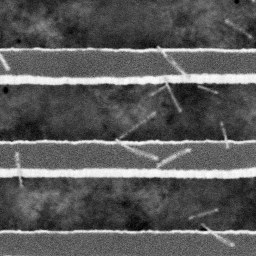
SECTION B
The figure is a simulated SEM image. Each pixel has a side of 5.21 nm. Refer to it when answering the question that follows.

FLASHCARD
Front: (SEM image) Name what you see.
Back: lines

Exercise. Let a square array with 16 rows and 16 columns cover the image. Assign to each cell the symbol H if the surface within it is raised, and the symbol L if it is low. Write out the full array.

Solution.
LLLLLLLLLLLLLLLL
LLLLLLLLLLLLLLLL
LLLLLLLLLLLLLLLL
HHHHHHHHHHHHHHHH
HHHHHHHHHHHHHHHH
LLLLLLLLLLLLLLLL
LLLLLLLLLLLLLLLL
LLLLLLLLLLLLLLLL
LLLLLLLLLLLLLLLL
HHHHHHHHHHHHHHHH
HHHHHHHHHHHHHHHH
LLLLLLLLLLLLLLLL
LLLLLLLLLLLLLLLL
LLLLLLLLLLLLLLLL
HHHHHHHHHHHHHHHH
HHHHHHHHHHHHHHHH